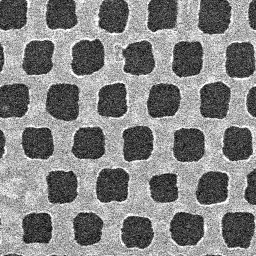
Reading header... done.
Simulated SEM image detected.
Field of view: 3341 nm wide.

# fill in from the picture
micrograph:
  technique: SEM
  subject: a regular array of holes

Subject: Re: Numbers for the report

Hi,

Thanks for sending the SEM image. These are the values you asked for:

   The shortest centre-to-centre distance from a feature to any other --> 632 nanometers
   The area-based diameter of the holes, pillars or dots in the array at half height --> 35.7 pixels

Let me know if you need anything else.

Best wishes